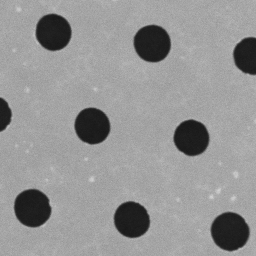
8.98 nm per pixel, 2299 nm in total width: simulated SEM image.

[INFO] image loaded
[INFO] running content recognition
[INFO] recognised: holes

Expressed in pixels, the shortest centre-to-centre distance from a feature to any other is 99.4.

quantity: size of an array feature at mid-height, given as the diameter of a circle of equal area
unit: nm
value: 326